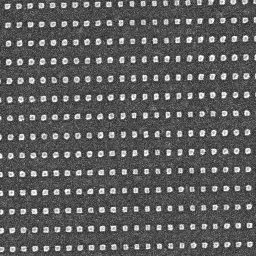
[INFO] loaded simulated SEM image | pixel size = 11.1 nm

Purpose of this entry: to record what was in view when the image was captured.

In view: a regular array of raised bodies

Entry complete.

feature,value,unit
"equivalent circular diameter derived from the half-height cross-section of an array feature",5.05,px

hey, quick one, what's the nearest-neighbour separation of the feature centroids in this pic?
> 123 nanometers